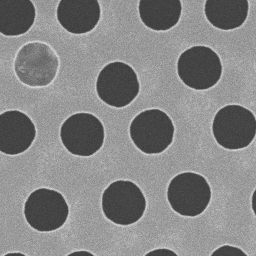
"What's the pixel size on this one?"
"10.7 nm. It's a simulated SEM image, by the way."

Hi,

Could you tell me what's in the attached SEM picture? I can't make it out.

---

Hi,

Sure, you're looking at a regular array of holes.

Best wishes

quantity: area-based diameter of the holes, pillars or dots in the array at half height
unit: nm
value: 471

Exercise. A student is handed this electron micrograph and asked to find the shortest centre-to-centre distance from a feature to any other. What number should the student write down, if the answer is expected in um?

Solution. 0.706